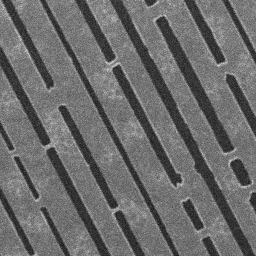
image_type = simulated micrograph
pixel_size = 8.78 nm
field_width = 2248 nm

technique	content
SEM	parallel lines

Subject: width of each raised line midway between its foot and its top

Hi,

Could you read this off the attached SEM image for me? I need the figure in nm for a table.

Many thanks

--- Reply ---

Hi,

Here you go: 204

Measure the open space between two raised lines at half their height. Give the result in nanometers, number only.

86.5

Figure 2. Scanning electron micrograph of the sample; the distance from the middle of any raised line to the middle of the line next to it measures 283 nanometres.